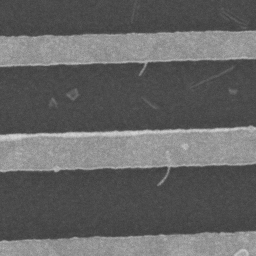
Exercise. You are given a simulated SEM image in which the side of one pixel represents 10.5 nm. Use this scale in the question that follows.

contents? lines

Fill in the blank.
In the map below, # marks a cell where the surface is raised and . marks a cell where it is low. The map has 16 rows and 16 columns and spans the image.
................
................
################
################
................
................
................
................
.###############
################
######.#........
................
................
................
...............#
################